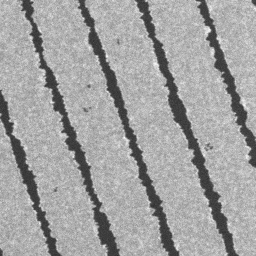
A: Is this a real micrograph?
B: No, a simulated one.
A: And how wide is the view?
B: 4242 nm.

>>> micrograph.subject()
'parallel lines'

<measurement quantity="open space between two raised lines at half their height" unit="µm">0.173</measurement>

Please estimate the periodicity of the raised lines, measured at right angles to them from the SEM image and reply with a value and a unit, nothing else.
920 nm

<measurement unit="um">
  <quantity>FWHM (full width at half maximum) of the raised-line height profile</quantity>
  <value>0.721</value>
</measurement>